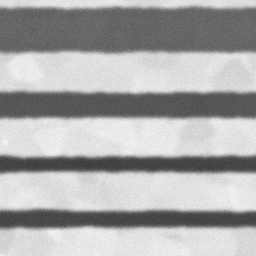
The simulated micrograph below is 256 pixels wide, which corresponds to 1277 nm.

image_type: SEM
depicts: lines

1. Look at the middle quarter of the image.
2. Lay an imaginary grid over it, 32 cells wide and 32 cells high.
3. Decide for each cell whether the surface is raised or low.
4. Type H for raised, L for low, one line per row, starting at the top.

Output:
HHHHHHHHHHHHHHHHHHHHHHHHHHHHHHHH
HHHHHHHHHHHHHHHHHHHHHHHHHHHHHHHH
HHHHHHHHHHHHHHHHHHHHHHHHHHHHHHHH
HHHHHHHHHHHHHHHHHHHHHHHHHHHHHHHH
HHHHHHHHHHHHHHHHHHHHHHHHHHHHHHHH
HHHHHHHHHHHHHHHHHHHHHHHHHHHHHHHH
HHHHHHHHHHHHHHHHHHHHHHHHHHHHHHHH
LLLLLLLLLLLLLLLLLLLLLLLLLLLLLLLL
LLLLLLLLLLLLLLLLLLLLLLLLLLLLLLLL
LLLLLLLLLLLLLLLLLLLLLLLLLLLLLLLL
LLLLLLLLLLLLLLLLLLLLLLLLLLLLLLLL
LLLLLLLLLLLLLLLLLLLLLLLLLLLLLLLL
LLLLLLLLLLLLLLLLLLLLLLLLLLLLLLLL
LLLLLLLLLLLLLLLLLLLLLLLLLLLLLLLL
HHHHHHHHHHHHHHHHHHHHHHHHHHHHHHHH
HHHHHHHHHHHHHHHHHHHHHHHHHHHHHHHH
HHHHHHHHHHHHHHHHHHHHHHHHHHHHHHHH
HHHHHHHHHHHHHHHHHHHHHHHHHHHHHHHH
HHHHHHHHHHHHHHHHHHHHHHHHHHHHHHHH
HHHHHHHHHHHHHHHHHHHHHHHHHHHHHHHH
HHHHHHHHHHHHHHHHHHHHHHHHHHHHHHHH
HHHHHHHHHHHHHHHHHHHHHHHHHHHHHHHH
HHHHHHHHHHHHHHHHHHHHHHHHHHHHHHHH
LLLLLLLLLLLLLLLLLLLLLLLLLLLLLLLL
LLLLLLLLLLLLLLLLLLLLLLLLLLLLLLLL
LLLLLLLLLLLLLLLLLLLLLLLLLLLLLLLL
LLLLLLLLLLLLLLLLLLLLLLLLLLLLLLLL
HHHHHHHHHHHHHHHHHHHHHHHHHHHHHHHH
HHHHHHHHHHHHHHHHHHHHHHHHHHHHHHHH
HHHHHHHHHHHHHHHHHHHHHHHHHHHHHHHH
HHHHHHHHHHHHHHHHHHHHHHHHHHHHHHHH
HHHHHHHHHHHHHHHHHHHHHHHHHHHHHHHH